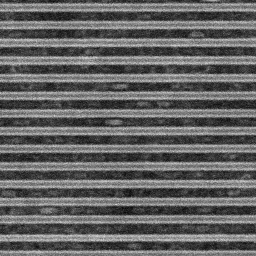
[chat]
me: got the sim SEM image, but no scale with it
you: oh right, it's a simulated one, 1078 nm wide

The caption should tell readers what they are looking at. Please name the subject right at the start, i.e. parallel lines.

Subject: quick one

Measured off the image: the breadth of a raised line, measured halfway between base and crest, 25.3 nm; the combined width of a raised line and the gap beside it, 74.7 nm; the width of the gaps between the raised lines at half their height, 45.8 nm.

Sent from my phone